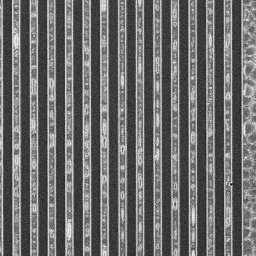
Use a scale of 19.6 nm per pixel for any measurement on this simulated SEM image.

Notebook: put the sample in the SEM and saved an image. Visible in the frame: parallel lines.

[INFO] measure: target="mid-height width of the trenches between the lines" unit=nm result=199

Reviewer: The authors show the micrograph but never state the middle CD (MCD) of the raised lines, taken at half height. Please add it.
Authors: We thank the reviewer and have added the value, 0.147 µm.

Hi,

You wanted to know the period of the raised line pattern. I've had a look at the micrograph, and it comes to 346 nm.